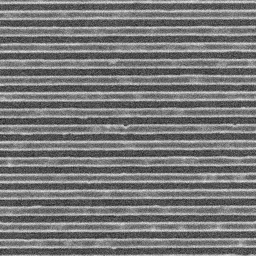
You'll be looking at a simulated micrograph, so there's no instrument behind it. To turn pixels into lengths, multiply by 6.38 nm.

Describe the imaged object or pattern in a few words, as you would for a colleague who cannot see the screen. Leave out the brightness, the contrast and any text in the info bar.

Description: parallel lines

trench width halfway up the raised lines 0.0486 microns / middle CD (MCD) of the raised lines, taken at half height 54.2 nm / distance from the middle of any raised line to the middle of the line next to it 104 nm